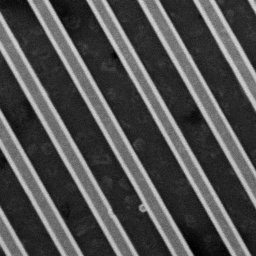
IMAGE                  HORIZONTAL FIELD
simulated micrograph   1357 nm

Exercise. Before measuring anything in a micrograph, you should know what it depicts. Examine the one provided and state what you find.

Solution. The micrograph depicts parallel lines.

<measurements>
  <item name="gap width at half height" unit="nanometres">168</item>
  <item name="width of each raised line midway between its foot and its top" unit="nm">83.5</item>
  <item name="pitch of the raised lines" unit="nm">256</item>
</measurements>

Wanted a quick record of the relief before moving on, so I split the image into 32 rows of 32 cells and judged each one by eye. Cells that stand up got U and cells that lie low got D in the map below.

DDDDUUDDDDDUUDDDDDUUDDDDDUUDDDDD
DDDDDUUDDDDDUUDDDDUUDDDDDUUDDDDD
DDDDDUUDDDDDUUDDDDDUUDDDDDUUDDDD
UDDDDDUUDDDDDUUDDDDUUUDDDDUUUDDD
UUDDDDUUDDDDDDUUDDDDUUDDDDDUUDDD
UUDDDDDUUDDDDDUUDDDDDUUDDDDDUUDD
UUUDDDDUUDDDDDDUUDDDDUUDDDDDUUDD
DUUDDDDDUUDDDDDUUDDDDDUUDDDDDUUD
DDUUDDDDDUUDDDDDUUDDDDUUDDDDDUUD
DDUUDDDDDUUDDDDDUUDDDDDUUDDDDDUU
DDDUUDDDDDUUDDDDDUUDDDDUUUDDDDUU
DDDUUUDDDDUUDDDDDDUUDDDDUUDDDDDU
DDDDUUDDDDDUUDDDDDUUDDDDDUUDDDDU
DDDDUUUDDDDUUDDDDDDUUDDDDUUDDDDD
DDDDDUUDDDDDUUDDDDDUUDDDDDUUDDDD
UDDDDDUUDDDDUUUDDDDDUUDDDDUUDDDD
UDDDDDUUDDDDDUUDDDDDUUDDDDDUUDDD
UUDDDDDUUDDDDDUUDDDDDUUDDDDUUUDD
UUUDDDDUUDDDDDUUDDDDDDUUDDDDUUDD
DUUDDDDDUUDDDDDUUDDDDDUUDDDDDUUD
DUUUDDDDUUUDDDDUUDDDDDDUUDDDDUUD
DDUUDDDDDUUDDDDDUUDDDDDUUDDDDDUU
DDDUUDDDDUUUDDDDUUUDDDDDUUDDDDUU
DDDUUDDDDDUUDDDDDUUDDDDDUUDDDDDU
DDDDUUDDDDDUUDDDDDUUDDDDDUUDDDDU
DDDDUUUDDDDUUDDDDDUUDDDDDUUDDDDD
DDDDDUUDDDDDUUDDDDDUUDDDDDUUDDDD
UDDDDUUUDDDDUUUDDDDUUDDDDDDUUDDD
UDDDDDUUDDDDDUUDDDDDUUDDDDDUUDDD
UUDDDDDUUDDDDUUUDDDDUUUDDDDDUUDD
UUDDDDDUUDDDDDUUDDDDDUUDDDDDUUDD
DUUDDDDDUUDDDDDUUDDDDDUUDDDDDUUD